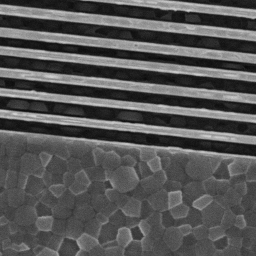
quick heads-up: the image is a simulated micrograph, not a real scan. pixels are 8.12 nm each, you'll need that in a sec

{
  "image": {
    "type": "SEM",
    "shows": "parallel lines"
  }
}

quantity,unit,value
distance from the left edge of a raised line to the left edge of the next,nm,169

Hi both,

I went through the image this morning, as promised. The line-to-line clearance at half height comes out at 103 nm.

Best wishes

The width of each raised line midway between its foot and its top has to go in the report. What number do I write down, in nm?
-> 68.7